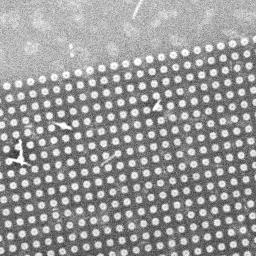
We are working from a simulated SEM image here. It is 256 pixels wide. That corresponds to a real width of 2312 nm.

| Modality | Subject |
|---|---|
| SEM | a regular array of raised bodies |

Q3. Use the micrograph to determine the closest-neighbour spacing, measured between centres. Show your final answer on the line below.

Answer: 108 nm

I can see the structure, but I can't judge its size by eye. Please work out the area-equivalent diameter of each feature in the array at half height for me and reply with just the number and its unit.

0.0539 micrometres